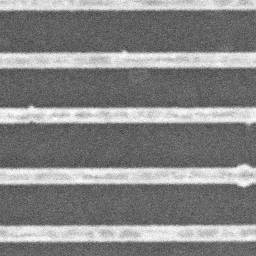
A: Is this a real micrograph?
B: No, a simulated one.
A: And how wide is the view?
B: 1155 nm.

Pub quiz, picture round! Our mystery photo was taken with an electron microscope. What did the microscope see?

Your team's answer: parallel lines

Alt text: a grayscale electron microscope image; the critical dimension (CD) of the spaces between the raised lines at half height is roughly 45.3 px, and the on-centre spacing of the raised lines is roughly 260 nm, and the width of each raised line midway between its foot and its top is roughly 0.0569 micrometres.